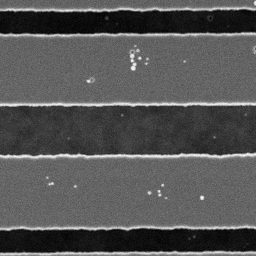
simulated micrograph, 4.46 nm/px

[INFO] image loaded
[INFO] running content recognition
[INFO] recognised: lines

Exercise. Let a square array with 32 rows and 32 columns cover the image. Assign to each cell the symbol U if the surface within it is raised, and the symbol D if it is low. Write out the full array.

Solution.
UUUUUUUUUUUUUUUUUUUUUUUUUUUUUUUU
DDDDDDDDDDDDDDDDDDDDDDDDDDDDDDDD
DDDDDDDDDDDDDDDDDDDDDDDDDDDDDDDD
DDDDDDDDDDDDDDDDDDDDDDDDDDDDDDDD
UUUUUUUUUUUUUUUUUUUUUUUUUUUUUUUU
UUUUUUUUUUUUUUUUUUUUUUUUUUUUUUUU
UUUUUUUUUUUUUUUUUUUUUUUUUUUUUUUU
UUUUUUUUUUUUUUUUUUUUUUUUUUUUUUUU
UUUUUUUUUUUUUUUUUUUUUUUUUUUUUUUU
UUUUUUUUUUUUUUUUUUUUUUUUUUUUUUUU
UUUUUUUUUUUUUUUUUUUUUUUUUUUUUUUU
UUUUUUUUUUUUUUUUUUUUUUUUUUUUUUUU
UUUUUUUUUUUUUUUUUUUUUUUUUUUUUUUU
DDDDDDDDDDDDDDDDDDDDDDDDDDDDDDDD
DDDDDDDDDDDDDDDDDDDDDDDDDDDDDDDD
DDDDDDDDDDDDDDDDDDDDDDDDDDDDDDDD
DDDDDDDDDDDDDDDDDDDDDDDDDDDDDDDD
DDDDDDDDDDDDDDDDDDDDDDDDDDDDDDDD
DDDDDDDDDDDDDDDDDDDDDDDDDDDDDDDD
UUUUUUUUUUUUUUUUUUUUUUUUUUUUUUUU
UUUUUUUUUUUUUUUUUUUUUUUUUUUUUUUU
UUUUUUUUUUUUUUUUUUUUUUUUUUUUUUUU
UUUUUUUUUUUUUUUUUUUUUUUUUUUUUUUU
UUUUUUUUUUUUUUUUUUUUUUUUUUUUUUUU
UUUUUUUUUUUUUUUUUUUUUUUUUUUUUUUU
UUUUUUUUUUUUUUUUUUUUUUUUUUUUUUUU
UUUUUUUUUUUUUUUUUUUUUUUUUUUUUUUU
UUUUUUUUUUUUUUUUUUUUUUUUUUUUUUUU
UUUUUUUUUUUUUUUUUUDUUUDUUUUUUUDU
DDDDDDDDDDDDDDDDDDDDDDDDDDDDDDDD
DDDDDDDDDDDDDDDDDDDDDDDDDDDDDDDD
DDDDDDDDUDDUDDUDUUUUUUUUUUUUUUUU